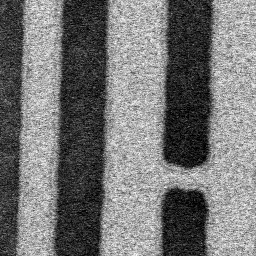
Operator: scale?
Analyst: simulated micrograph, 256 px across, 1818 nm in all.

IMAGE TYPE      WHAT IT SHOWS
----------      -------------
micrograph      one or a few lines or trenches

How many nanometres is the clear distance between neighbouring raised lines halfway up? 334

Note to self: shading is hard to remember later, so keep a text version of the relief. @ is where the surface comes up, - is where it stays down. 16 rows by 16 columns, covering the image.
--@@---@@@---@@@
--@@---@@@---@@@
--@@---@@@---@@@
--@@---@@@---@@@
-@@@---@@@---@@@
-@@@---@@@---@@@
-@@@---@@@---@@@
-@@@---@@@---@@@
-@@@---@@@---@@@
-@@@---@@@---@@@
-@@@---@@@@@@@@@
-@@---@@@@@@@@@@
-@@---@@@@---@@@
-@@---@@@@---@@@
-@@---@@@@---@@@
-@@---@@@@---@@@